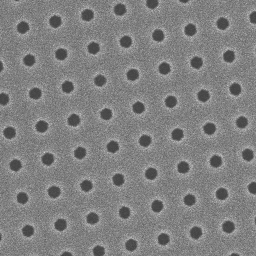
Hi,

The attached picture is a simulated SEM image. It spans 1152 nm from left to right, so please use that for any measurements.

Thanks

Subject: a regular array of holes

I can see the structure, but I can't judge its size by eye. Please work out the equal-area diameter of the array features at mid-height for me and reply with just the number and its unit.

55.9 nanometers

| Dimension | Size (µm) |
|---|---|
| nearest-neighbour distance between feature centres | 0.147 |